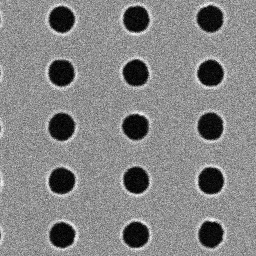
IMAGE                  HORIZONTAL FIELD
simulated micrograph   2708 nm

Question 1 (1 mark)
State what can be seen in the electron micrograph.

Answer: a regular array of holes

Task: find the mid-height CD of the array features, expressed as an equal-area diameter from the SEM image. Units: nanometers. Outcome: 289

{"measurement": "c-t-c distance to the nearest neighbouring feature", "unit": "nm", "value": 566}